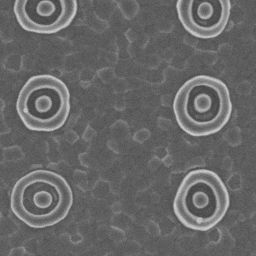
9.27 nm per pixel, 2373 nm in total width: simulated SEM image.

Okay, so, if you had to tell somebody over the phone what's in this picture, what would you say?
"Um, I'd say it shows ring-shaped raised bodies with a dot in the middle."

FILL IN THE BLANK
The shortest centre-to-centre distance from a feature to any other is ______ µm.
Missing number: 0.872